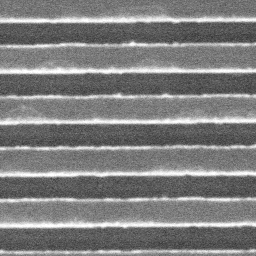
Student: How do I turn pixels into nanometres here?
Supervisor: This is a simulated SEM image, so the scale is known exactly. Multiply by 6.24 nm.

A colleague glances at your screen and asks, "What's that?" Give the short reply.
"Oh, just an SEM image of lines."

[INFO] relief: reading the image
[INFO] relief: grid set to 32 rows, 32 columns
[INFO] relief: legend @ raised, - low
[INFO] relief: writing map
@@@@@@@@@@@@@@@@@@@@@@@@@@@@@@@@
@@@@@@@@@@@@@@@@@@@@@@@@@@@@@@@@
@@@@@@@@@@@@@@@-----@@@@@@-@@@--
--------------------------------
--------------------------------
-------------------------------@
@@@@@@@@@@@@@@@@@@@@@@@@@@@@@@@@
@@@@@@@@@@@@@@@@@@@@@@@@@@@@@@@@
@@@@@@@@@@@@@@@@@@@@@@@@@@@@@@@@
--------------------------------
--------------------------------
--------------------------------
@@@@@@@@@@@@@@@@@@@@@@@@@@@@@@@@
@@@@@@@@@@@@@@@@@@@@@@@@@@@@@@@@
@@@@@@@@@@@@@@@@@@@@@@@@@@@@@@@@
--------------------------------
--------------------------------
--------------------------------
--@@---@@@@@@@@@@@@@@@@@@@@@@@@@
@@@@@@@@@@@@@@@@@@@@@@@@@@@@@@@@
@@@@@@@@@@@@@@@@@@@@@@@@@@@@@@@@
@@@@@@@@@@@@@@@@@@@@@@@@@@@@@@@@
--------------------------------
--------------------------------
--------------------------------
@@@@@@@@@@@@@@@@@@@@@@@@@@@@@@@@
@@@@@@@@@@@@@@@@@@@@@@@@@@@@@@@@
@@@@@@@@@@@@@@@@@@@@@@@@@@@@@@@@
--------------------------------
--------------------------------
--------------------------------
@----@------@@@-@@@@@@@@@@@@@@@@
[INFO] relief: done